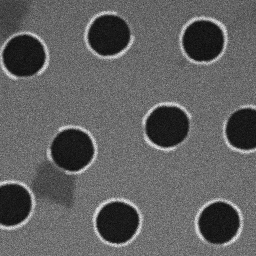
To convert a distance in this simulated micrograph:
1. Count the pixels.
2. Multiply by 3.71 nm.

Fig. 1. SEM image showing holes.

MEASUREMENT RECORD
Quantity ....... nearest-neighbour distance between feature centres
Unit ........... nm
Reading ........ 324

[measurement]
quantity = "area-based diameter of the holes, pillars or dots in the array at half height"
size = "156 nanometers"